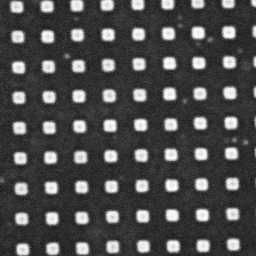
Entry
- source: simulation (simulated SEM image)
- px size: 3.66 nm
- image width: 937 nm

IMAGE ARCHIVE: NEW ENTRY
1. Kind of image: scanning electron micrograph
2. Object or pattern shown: a regular array of raised bodies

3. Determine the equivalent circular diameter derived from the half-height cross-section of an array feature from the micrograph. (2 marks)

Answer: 0.0432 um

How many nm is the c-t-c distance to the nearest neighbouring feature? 109